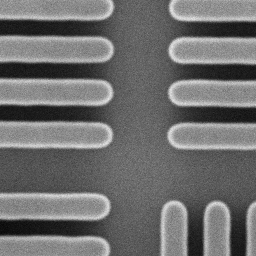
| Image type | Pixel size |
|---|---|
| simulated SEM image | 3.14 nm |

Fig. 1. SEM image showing groups of lines, slits or small figures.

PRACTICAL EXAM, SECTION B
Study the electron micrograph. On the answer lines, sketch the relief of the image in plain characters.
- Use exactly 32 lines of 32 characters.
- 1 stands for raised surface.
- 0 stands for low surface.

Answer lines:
11111111111111000000011111111111
11111111111111000000011111111111
00000000000000000000001111111111
00000000000000000000000000000000
00000000000000000000000000000000
11111111111111000000001111111111
11111111111111000000011111111111
11111111111110000000001111111111
00000000000000000000000000000000
00000000000000000000000000000000
11111111111111000000001111111111
11111111111111000000011111111111
11111111111111000000001111111111
00000000000000000000000000000000
00000000000000000000000000000000
11111111111110000000000100000000
11111111111111000000011111111111
11111111111111000000011111111111
00000000000000000000000011111111
00000000000000000000000000000000
00000000000000000000000000000000
00000000000000000000000000000000
00000000000000000000000000000000
00000000000000000000000000000000
11111111111110000000000000000000
11111111111111000000011000110000
11111111111111000000111000111001
00000000000000000000111000111001
00000000000000000000111000111001
00000000000000000000111000111001
11111111111110000000111000111001
11111111111111000000111000111001